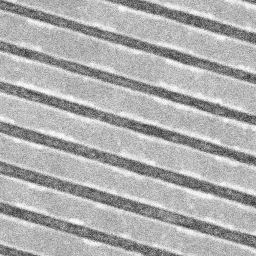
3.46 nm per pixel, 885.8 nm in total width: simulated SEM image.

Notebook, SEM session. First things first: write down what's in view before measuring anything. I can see parallel lines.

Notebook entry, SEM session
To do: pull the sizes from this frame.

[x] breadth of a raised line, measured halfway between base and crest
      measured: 0.0912 micrometres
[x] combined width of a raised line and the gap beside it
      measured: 0.135 micrometres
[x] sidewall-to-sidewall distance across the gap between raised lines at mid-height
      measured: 42.2 nanometers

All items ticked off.